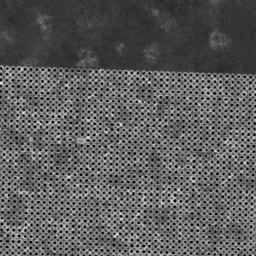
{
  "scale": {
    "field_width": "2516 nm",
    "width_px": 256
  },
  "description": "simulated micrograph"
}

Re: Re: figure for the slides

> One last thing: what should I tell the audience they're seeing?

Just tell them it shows a regular array of holes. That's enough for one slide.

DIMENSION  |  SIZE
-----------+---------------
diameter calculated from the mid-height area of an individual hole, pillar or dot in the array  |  33.3 nm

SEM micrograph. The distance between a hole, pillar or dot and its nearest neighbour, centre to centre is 52.9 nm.